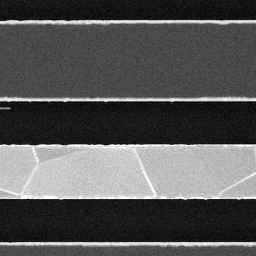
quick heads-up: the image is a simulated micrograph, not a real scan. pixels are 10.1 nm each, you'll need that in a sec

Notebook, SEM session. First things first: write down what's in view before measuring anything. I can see lines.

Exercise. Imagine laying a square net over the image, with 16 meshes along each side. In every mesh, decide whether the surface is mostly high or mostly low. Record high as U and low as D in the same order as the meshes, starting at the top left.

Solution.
DDDDDDDDDDDDDDDD
UUUUUUUUUUUUUUUU
UUUUUUUUUUUUUUUU
UUUUUUUUUUUUUUUU
UUUUUUUUUUUUUUUU
UUUUUUUUUUUUUUUU
DDDDDDDDDDDDDDDD
DDDDDDDDDDDDDDDD
DDDDDDDDDDDDDDDD
UUUUUUUUUUUUUUUU
UUUUUUUUUUUUUUUU
UUUUUUUUUUUUUUUU
DDDDDDDDDDDDDDDD
DDDDDDDDDDDDDDDD
DDDDDDDDDDDDDDDD
UUUUUUUUUUUUUUUU